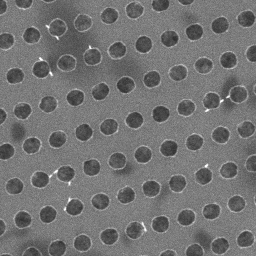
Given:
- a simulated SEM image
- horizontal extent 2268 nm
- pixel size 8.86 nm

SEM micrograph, a regular array of raised bodies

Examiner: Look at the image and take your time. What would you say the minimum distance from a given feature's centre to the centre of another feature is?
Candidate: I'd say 232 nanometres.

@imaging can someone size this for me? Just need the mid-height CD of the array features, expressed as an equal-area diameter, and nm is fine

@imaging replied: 159